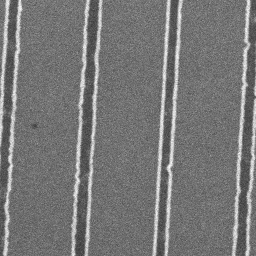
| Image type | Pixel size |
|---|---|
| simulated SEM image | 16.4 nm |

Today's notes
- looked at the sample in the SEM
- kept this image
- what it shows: one or a few lines or trenches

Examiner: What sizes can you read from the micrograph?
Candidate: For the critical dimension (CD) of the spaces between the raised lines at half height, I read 1110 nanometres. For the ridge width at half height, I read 210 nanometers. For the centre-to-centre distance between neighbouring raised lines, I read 1310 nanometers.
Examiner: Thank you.